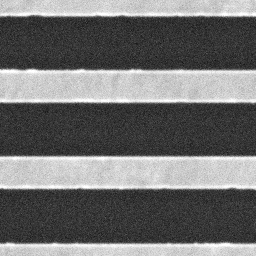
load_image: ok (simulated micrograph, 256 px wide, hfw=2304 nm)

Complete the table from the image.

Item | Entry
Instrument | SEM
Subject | lines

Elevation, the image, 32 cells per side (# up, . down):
################################
################################
................................
................................
................................
................................
................................
................................
................................
################################
################################
################################
################################
................................
................................
................................
................................
................................
................................
................................
################################
################################
################################
...............#...............#
................................
................................
................................
................................
................................
................................
##....#..............#..#####...
################################